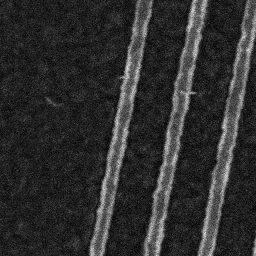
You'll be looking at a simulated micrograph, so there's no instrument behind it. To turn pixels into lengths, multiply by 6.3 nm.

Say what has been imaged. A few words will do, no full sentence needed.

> parallel lines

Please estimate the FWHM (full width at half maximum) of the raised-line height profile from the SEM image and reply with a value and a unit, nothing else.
0.0797 um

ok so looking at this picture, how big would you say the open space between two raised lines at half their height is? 40.9 pixels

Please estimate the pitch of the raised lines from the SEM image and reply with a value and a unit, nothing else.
336 nm